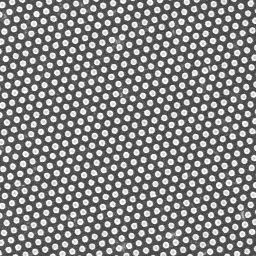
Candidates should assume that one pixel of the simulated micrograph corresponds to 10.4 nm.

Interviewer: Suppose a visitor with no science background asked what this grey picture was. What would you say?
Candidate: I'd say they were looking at a regular array of raised bodies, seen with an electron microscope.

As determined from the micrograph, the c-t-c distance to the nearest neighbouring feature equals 104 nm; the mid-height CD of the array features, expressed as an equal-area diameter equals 0.0575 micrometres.